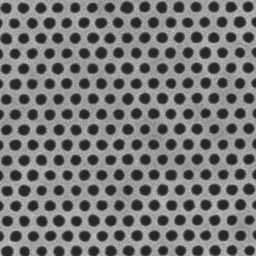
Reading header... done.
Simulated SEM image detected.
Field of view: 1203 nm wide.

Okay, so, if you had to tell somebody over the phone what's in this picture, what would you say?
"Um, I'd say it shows a regular array of holes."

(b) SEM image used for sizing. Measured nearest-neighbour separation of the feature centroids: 80.3 nm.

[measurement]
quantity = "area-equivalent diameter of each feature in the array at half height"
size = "49.5 nm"